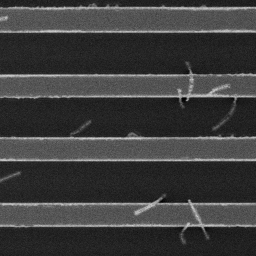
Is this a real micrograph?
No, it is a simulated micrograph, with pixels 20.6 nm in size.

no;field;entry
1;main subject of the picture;lines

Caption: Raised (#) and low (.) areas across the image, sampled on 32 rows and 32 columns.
................................
################################
################################
################################
................................
................................
................................
................................
................................
################################
################################
################################
................................
................................
................................
................................
................................
################################
################################
################################
................................
................................
................................
................................
................................
################################
################################
################################
................................
................................
................................
................................